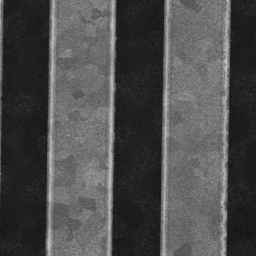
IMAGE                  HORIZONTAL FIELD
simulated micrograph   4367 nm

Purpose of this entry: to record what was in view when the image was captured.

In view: one or a few lines or trenches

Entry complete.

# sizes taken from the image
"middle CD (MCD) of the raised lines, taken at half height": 1020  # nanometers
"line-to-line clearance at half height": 921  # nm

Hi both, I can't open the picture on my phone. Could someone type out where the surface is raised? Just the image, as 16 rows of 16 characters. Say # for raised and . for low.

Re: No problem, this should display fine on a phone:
...####....###..
...####...####..
...####...####..
...####...####..
...####...####..
...####...####..
...####...####..
...####...####..
...####...####..
...####...####..
...####...####..
...####...####..
...####...####..
...####...####..
...####...####..
...####...####..